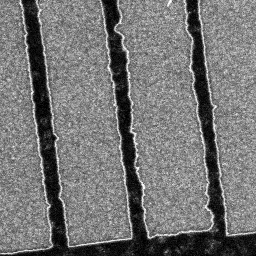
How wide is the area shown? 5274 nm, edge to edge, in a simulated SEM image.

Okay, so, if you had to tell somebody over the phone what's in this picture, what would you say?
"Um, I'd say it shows one or a few lines or trenches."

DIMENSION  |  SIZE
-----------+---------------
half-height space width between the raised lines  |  1300 nm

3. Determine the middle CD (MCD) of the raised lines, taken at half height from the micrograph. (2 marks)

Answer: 0.35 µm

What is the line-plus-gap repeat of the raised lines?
1660 nm